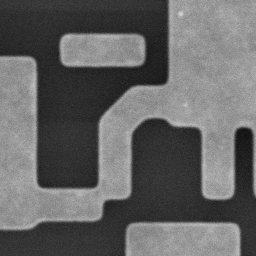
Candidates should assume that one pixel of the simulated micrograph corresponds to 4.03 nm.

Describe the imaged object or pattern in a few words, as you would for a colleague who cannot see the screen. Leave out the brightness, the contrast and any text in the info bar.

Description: wiring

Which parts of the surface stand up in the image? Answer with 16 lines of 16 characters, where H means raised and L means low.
LLLLLLLLLLLHHHHH
LLLLLLLLLLLHHHHH
LLLLHHHHHLLHHHHH
LLLLHHHHHLLHHHHH
HHLLLLLLLLLHHHHH
HHLLLLLLHHHHHHHH
HHLLLLLHHHHHHHHH
HHLLLLHHHLHHHHHH
HHLLLLHHLLLLLHHL
HHLLLLHHLLLLLHHL
HHLLLLHHLLLLLHHL
HHLLLLHHLLLLLHHL
HHHHHHHLLLLLLLLL
HHHHHHLLLLLLLLLL
LLLLLLLLHHHHHHHL
LLLLLLLLHHHHHHHL